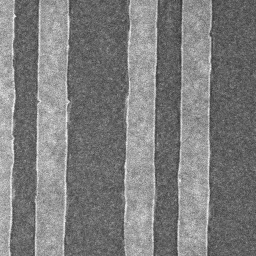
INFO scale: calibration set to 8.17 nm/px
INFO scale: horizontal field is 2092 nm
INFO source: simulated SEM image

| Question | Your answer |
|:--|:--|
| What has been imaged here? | one or a few lines or trenches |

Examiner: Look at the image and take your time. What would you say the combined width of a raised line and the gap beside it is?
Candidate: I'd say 583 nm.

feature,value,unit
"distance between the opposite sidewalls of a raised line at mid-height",230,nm